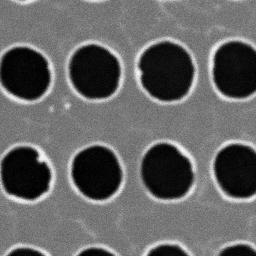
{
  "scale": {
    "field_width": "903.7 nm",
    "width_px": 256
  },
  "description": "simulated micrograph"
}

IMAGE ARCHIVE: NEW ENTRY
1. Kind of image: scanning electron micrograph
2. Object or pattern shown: holes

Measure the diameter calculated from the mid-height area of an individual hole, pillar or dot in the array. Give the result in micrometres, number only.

0.187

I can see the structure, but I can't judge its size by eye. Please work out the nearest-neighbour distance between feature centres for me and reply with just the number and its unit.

250 nanometers